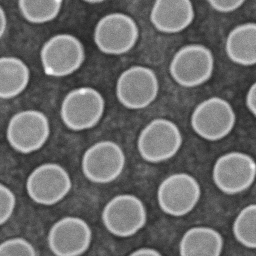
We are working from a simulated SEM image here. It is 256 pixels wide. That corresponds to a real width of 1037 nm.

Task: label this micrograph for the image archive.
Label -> a regular array of raised bodies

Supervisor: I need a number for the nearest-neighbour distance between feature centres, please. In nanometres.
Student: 231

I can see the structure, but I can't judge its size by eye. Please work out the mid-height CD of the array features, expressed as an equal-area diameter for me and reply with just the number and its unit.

164 nm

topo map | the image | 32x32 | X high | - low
--XXXXX-------------XXXX--XXXX--
---XXXX------------XXXXX--------
X---XX-------XXX---XXXXX--------
X-----------XXXXX---XXX-------XX
-------XX---XXXXX------------XXX
------XXXX--XXXXX-----------XXXX
-----XXXXX---XX-------XXXX---XXX
XX---XXXXX------------XXXXX--XXX
XXX---XXXX-------X---XXXXX------
XXX------------XXXX---XXXX------
XXX------------XXXXX---XX-------
XX-------XXX---XXXXX-----------X
--------XXXXX--XXXX-------XX---X
--------XXXXX------------XXXX--X
--XXX---XXXX------------XXXXX---
-XXXXX--XXXX-------XXX--XXXXX---
-XXXXX------------XXXX---XXXX---
-XXXXX-----------XXXXXX---------
--XXX------XXXX--XXXXX----------
-----------XXXX---XXX-------XXX-
----------XXXXX------------XXXXX
----XXXX---XXXX------------XXXXX
----XXXXX---XX-------XXX---XXXXX
X--XXXXXX-----------XXXXX---XXX-
XX--XXXX-------X----XXXXX-------
XX------------XXXX--XXXX--------
X------------XXXXX---XX-------XX
X-------XX---XXXXX------------XX
-------XXXX--XXXX------------XXX
------XXXXX------------XXXX---XX
XXXX--XXXXX------------XXXXX---X
XXXX---XXX-------XX----XXXX-----